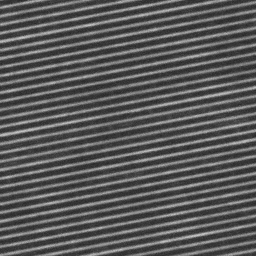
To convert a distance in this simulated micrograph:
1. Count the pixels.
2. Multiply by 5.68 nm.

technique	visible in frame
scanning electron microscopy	parallel lines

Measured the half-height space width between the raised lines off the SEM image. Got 35.6 nanometers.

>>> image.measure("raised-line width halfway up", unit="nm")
10.4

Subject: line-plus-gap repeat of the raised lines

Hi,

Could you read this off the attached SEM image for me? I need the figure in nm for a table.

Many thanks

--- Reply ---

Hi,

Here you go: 47.7